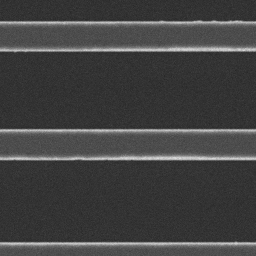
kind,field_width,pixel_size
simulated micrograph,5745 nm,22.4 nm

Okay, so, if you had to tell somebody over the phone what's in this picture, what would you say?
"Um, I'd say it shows lines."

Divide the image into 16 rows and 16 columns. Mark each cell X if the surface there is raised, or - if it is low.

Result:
----------------
XXXXXXXXXXXXXXXX
XXXXXXXXXXXXXXXX
----------------
----------------
----------------
----------------
----------------
XXXXXXXXXXXXXXXX
XXXXXXXXXXXXXXXX
----------------
----------------
----------------
----------------
----------------
XXXXXXXXXXXXXXXX